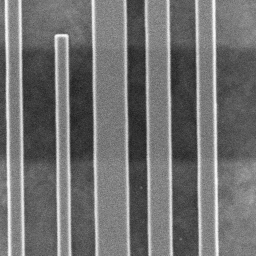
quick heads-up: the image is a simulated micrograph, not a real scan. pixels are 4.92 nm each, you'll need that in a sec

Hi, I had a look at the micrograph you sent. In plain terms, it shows groups of lines, slits or small figures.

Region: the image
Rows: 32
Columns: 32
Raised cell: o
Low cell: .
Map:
.oo.........oooo..ooo....oo.....
.oo.........oooo..ooo....oo.....
.oo.........oooo..ooo....oo.....
.oo.........oooo..ooo....oo.....
.oo....o....oooo..ooo....oo.....
.oo....o....oooo..ooo....oo.....
.oo....o....oooo..ooo....oo.....
.oo....o....oooo..ooo....oo.....
.oo....o....oooo..ooo....oo.....
.oo....o....oooo..ooo....oo.....
.oo....o....oooo..ooo....oo.....
.oo....o....oooo..ooo....oo.....
.oo....o....oooo..ooo....oo.....
.oo....o....oooo..ooo....oo.....
.oo....oo...oooo..ooo....oo.....
.oo....oo...oooo..ooo....oo.....
.oo....oo...oooo..ooo....oo.....
.oo....oo...oooo..ooo....oo.....
.oo....oo...oooo..ooo....oo.....
.oo....oo...oooo..ooo....oo.....
.oo....oo...oooo...oo....oo.....
.oo....oo...oooo...oo....oo.....
.oo....oo...oooo...oo....oo.....
.oo....oo...oooo...oo....oo.....
.oo....oo...oooo...oo....oo.....
.oo....oo...oooo...oo....oo.....
.oo....oo...oooo...oo....oo.....
.oo....oo...oooo...oo....oo.....
.oo....oo...oooo...oo....oo.....
.oo....oo...oooo...oo....oo.....
.oo....oo...oooo...oo....oo.....
.oo....oo...oooo...ooo...oo.....